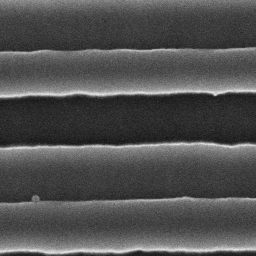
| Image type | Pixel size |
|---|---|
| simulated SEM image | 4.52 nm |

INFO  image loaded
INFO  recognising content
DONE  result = lines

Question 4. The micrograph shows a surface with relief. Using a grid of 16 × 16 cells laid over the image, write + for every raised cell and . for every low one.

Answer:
++++++++++++++++
++++++++++++++++
++++++++++++++++
++++++++++++++++
++++++++++++++++
++++++++++++++++
................
................
................
++++++++++++++++
++++++++++++++++
++++++++++++++++
++++++++++++++++
++++++++++++++++
++++++++++++++++
++++++++++++++++